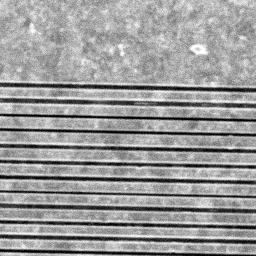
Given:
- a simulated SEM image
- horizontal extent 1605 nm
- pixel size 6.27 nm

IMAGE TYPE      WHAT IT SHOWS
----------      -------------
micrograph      parallel lines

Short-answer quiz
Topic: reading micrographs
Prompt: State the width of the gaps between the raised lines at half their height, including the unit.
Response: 0.0282 microns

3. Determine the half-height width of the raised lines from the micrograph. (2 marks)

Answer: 0.0666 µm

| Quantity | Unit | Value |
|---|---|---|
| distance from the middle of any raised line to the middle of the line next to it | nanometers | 94.9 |